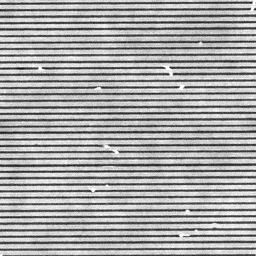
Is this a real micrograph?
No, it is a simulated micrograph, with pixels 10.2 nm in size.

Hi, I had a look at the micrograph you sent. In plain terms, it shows parallel lines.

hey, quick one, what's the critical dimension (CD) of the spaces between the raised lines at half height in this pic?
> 2.87 px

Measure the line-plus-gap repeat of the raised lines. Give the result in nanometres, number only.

66.3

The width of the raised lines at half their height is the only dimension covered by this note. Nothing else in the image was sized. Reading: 0.0396 micrometres